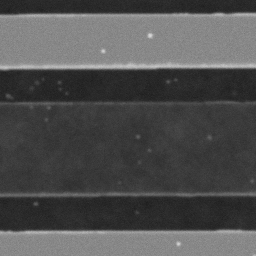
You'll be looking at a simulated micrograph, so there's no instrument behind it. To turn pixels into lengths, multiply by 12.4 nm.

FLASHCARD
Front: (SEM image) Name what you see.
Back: lines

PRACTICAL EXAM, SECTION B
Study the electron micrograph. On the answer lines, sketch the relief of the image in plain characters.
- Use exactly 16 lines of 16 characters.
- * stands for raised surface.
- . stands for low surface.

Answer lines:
................
****************
****************
****************
................
................
****************
****************
****************
****************
****************
****************
................
................
****************
****************